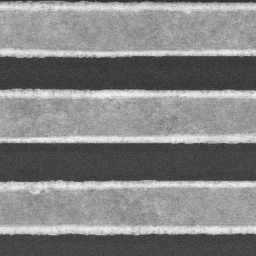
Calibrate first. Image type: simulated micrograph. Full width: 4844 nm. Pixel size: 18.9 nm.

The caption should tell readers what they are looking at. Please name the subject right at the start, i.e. lines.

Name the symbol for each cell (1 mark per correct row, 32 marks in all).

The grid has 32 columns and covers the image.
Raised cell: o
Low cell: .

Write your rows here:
oo..............................
oooooooooooooooooooooooooooooooo
oooooooooooooooooooooooooooooooo
oooooooooooooooooooooooooooooooo
oooooooooooooooooooooooooooooooo
oooooooooooooooooooooooooooooooo
oooooooooooooooooooooooooooooooo
................................
................................
................................
................................
oooooooooooooooooooooooooooooooo
oooooooooooooooooooooooooooooooo
oooooooooooooooooooooooooooooooo
oooooooooooooooooooooooooooooooo
oooooooooooooooooooooooooooooooo
oooooooooooooooooooooooooooooooo
oooooooooooooooooooooooooooooooo
................................
................................
................................
................................
................................
oooooooooooooooooooooooooooooooo
oooooooooooooooooooooooooooooooo
oooooooooooooooooooooooooooooooo
oooooooooooooooooooooooooooooooo
oooooooooooooooooooooooooooooooo
oooooooooooooooooooooooooooooooo
................................
................................
................................